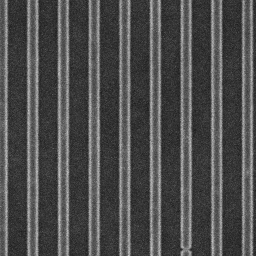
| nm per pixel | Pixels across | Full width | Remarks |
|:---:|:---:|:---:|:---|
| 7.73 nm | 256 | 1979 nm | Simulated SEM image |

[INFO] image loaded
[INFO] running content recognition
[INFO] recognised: parallel lines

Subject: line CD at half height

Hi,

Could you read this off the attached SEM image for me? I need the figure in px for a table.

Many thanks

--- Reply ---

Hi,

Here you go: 9.5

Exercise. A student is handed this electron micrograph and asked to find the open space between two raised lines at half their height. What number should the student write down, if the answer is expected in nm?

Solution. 167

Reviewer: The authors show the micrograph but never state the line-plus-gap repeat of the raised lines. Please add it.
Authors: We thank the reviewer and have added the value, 237 nanometres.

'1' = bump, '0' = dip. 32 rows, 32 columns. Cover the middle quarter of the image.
10000011100000110000001100000111
10000011100000110000001100000111
10000011100000110000001100000111
10000011100000110000001100000111
10000011100000110000001100000111
10000011100000110000001100000111
10000011100000110000001100000111
10000011100000110000001100000111
10000011100000110000001100000111
10000011100000110000001100000111
10000011100000110000001100000111
10000011100000110000001100000111
10000011100000110000001100000111
10000011100000110000001100000111
10000011100000110000001100000111
10000011100000110000001100000111
10000011100000110000001100000111
10000011100000110000001100000111
10000011100000110000001100000111
10000011100000110000001100000111
10000011100000110000001100000111
10000011100000110000001100000111
10000011100000110000001100000111
10000011100000110000001100000111
10000011100000110000001100000111
10000011100000110000001100000111
10000011100000110000001100000111
10000011100000110000001100000111
10000011100000110000001100000111
10000011100000110000001100000111
10000011100000110000001100000111
10000011100000110000001100000111